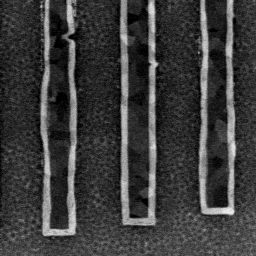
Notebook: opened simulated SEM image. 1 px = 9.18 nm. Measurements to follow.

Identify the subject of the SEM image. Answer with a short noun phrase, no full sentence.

one or a few lines or trenches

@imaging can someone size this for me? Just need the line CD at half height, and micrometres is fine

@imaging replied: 0.256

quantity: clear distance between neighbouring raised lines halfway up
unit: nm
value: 475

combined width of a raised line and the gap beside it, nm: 726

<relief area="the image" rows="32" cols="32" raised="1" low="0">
00000011100000001110000001111000
00000011100000001110000001111000
00000011100000011110000001111000
00000011100000011110000001111000
00000011100000011110000000111000
00000011100000001110000000111000
00000011100000001110000000111000
00000011100000001110000000111000
00000011100000001110000000111000
00000011100000001110000000111000
00000011100000001110000000111000
00000011100000001110000000111000
00000011100000001110000001111000
00000111100000001110000001111000
00000111100000001110000001111000
00000111100000001110000000111000
00000111100000001110000001111000
00000011100000001110000001111000
00000011100000001110000001111000
00000011100000001110000001111000
00000011100000001110000001111000
00000011100000001110000001111000
00000011100000001110000001111000
00000011100000001110000001111000
00000011100000001110000001111000
00000011100000001110000001111000
00000011100000001110000000000000
00000011100000001110000000000000
00000011100000000000000000000000
00000000000000000000000000000000
00000000000000000000000000000000
00000000000000000000000000000000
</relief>